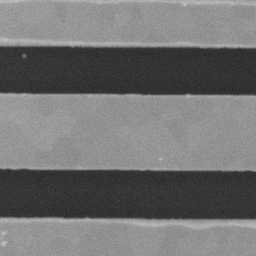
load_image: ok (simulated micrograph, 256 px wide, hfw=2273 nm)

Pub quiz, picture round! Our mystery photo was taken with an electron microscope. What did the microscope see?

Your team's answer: lines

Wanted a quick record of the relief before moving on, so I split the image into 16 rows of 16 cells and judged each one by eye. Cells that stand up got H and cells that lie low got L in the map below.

HHHHHHHHHHHHHHHH
HHHHHHHHHHHHHHHH
HHHHHHHHHHHHHHHH
LLLLLLLLLLLLLLLL
LLLLLLLLLLLLLLLL
LLLLLLLLLLLLLLLL
HHHHHHHHHHHHHHHH
HHHHHHHHHHHHHHHH
HHHHHHHHHHHHHHHH
HHHHHHHHHHHHHHHH
HHHHHHHHHHHHHHHH
LLLLLLLLLLLLLLLL
LLLLLLLLLLLLLLLL
LLLLLLLLLLLLLLLL
HHHHHHHHHHHHHHHH
HHHHHHHHHHHHHHHH